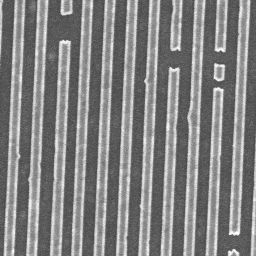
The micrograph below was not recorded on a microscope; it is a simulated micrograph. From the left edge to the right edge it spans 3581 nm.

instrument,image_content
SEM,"parallel lines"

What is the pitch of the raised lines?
22.4 pixels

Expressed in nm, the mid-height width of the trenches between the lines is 196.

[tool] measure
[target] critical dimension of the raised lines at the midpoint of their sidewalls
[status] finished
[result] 8.24 pixels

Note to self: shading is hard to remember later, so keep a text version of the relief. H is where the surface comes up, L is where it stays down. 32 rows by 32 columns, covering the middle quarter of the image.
HLLLHHLLLLHHLLLHHLLLLHHLLLLLLLLL
HLLLHHLLLLHHLLLHHLLLLHHLLLLLLLLL
HLLLHHLLLLHHLLLHHLLLLHHLLLLHLLLL
HLLLHHLLLLHHLLLHHLLLLHHLLLLHLLLL
HLLLHHLLLLHHLLLHHLLLHHHLLLLHLLLL
HLLLHHLLLLHHLLLHHLLLLHHLLLHHLLLL
HLLLHHLLLHHHLLLHHLLLLHHLLLHHLLLL
HLLLHHLLLHHLLLLHHLLLLHHLLLHHLLLL
HLLLHHLLLHHLLLLHHLLLLHHLLLHHLLLL
HLLLHHLLLHHLLLLHHLLLLHHLLLHHLLLL
HLLLHHLLLHHLLLLHHLLLHHHLLLHHLLLL
HLLLHHLLLHHLLLLHHLLLHHLLLLHHLLLL
HLLLHHLLLHHLLLLHHLLLHHLLLLHHLLLH
LLLLHLLLLHHLLLLHHLLLHHLLLLHHLLLH
LLLLHLLLLHHLLLLHHLLLHHLLLLHHLLLH
LLLLHLLLLHHLLLLHHLLLHHLLLLHHLLLH
LLLHHLLLLHHLLLLHHLLLHHLLLLHHLLLL
LLLHHLLLLHHLLLLHHLLLHHLLLLHHLLLL
LLLHHLLLLHHLLLLHHLLLHHLLLLHHLLLH
LLLHHLLLLHHLLLHHHLLLHHLLLLHHLLLH
LLLHHLLLLHHLLLHHHLLLHHLLLLHHLLLH
LLLHHLLLLHHLLLHHLLLLHHLLLLHHLLLH
LLLHHLLLLHHLLLHHLLLLHHLLLLHHLLLH
LLLHHLLLLHHLLLHHLLLLHHLLLLHHLLLH
LLLHHLLLLHHLLLHHLLLLHHLLLLHLLLLH
LLLHHLLLLHHLLLHHLLLLHHLLLLHLLLLH
LLLHHLLLLHHLLLHHLLLLHHLLLLHLLLLH
LLLHHLLLLHHLLLHHLLLLHHLLLLHLLLLH
LLLHHLLLLHHLLLHHLLLLHHLLLHHLLLLH
LLLHHLLLHHHLLLHHLLLLHHLLLHHLLLLH
LLLHHLLLHHLLLLHHLLLLHHLLLHHLLLLH
LLLHHLLLHHLLLLHHLLLLHHLLLHHLLLLH